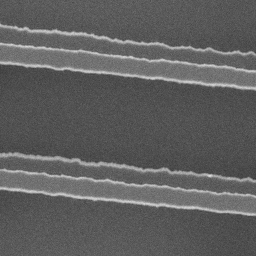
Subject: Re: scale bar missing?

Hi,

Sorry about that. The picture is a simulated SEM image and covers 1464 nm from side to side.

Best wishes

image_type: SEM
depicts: lines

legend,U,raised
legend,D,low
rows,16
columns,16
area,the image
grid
DDDDDDDDDDDDDDDD
DDDDDDDDDDDDDDDD
UUUUUUUDDDDDDDDD
UUUUUUUUUUUUUUUU
DDDDDUUUUUUUUUUU
DDDDDDDDDDDDDDDU
DDDDDDDDDDDDDDDD
DDDDDDDDDDDDDDDD
DDDDDDDDDDDDDDDD
DDDDDDDDDDDDDDDD
UUUUUUUUDDDDDDDD
UUUUUUUUUUUUUUUU
DDDDDDUUUUUUUUUU
DDDDDDDDDDDDDDDD
DDDDDDDDDDDDDDDD
DDDDDDDDDDDDDDDD